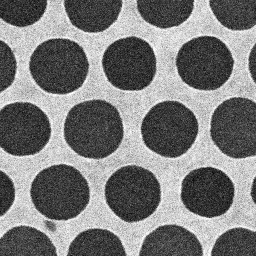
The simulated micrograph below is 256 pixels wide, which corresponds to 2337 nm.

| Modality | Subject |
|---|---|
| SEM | a regular array of holes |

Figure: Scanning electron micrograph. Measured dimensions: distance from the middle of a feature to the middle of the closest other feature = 0.661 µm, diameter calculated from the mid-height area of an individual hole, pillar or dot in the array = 522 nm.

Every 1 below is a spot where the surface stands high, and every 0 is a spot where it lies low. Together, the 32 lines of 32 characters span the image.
00000011000000011000000011000000
00000011000000011000000011100000
00000111100000011100000111100000
11111111110000111111011111110001
11111111111111111111111110011111
01111000001111000001111000001111
00110000000110000001110000000110
00110000000110000000110000000110
00110000000110000000110000000110
00110000000110000001110000000110
01111000001111000001111000001111
11111100011111111111111111111111
11111111111001111111101111110001
00000111100000011110000011100000
00000011000000011100000001000000
00000011000000011100000001000000
00000011000000001100000001000000
00000011000000011100000001100000
00000111100000011110000011100000
11001111110000111111000111110000
11111110111111111111111111111111
11111000001111000001111100001111
01110000000110000000111000000111
00110000000110000000111000000110
00110000000110000000111000000110
00110000000110000000111000000111
01111000001111000001111100001111
11111100111111100011111111111111
10001111111111111111000111111001
00000011100000011100000001100000
00000001100000011100000001100000
00000001000000001000000001000000